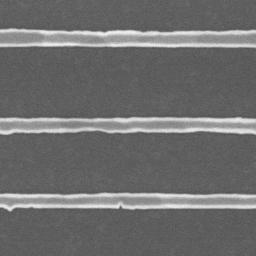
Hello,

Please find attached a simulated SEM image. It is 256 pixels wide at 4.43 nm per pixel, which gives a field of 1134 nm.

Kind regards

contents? one or a few lines or trenches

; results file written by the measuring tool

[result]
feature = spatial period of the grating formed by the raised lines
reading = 0.359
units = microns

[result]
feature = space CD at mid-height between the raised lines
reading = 306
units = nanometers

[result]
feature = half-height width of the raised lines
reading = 0.0559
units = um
